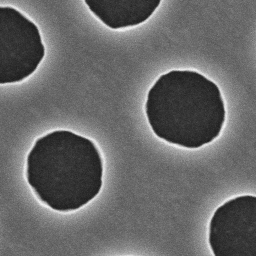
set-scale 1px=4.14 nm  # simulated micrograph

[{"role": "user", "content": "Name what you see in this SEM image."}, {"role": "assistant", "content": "holes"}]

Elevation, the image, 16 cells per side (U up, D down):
DUUUUUDDDDUUUUUU
DDUUUUUDDUUUUUUU
DDDUUUUUUUUUUUUU
DDDUUUUUUUUUUUUU
DDUUUUUUUUUDUUUU
UUUUUUUUUDDDDDUU
UUUUUUUUUDDDDDUU
UUUUUUUUUDDDDDUU
UUUDDUUUUUDDDDUU
UUDDDDUUUUUUUUUU
UUDDDDUUUUUUUUUU
UUDDDDUUUUUUUUUU
UUUDDDUUUUUUUUDD
UUUUUUUUUUUUUDDD
UUUUUUUUUUUUUDDD
UUUUUUUUUUUUUDDD